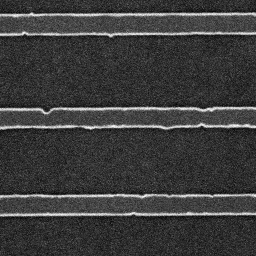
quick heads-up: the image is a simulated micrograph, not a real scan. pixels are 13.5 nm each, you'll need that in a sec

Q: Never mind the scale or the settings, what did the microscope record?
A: one or a few lines or trenches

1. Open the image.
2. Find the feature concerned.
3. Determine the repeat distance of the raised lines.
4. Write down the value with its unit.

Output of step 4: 1.22 micrometres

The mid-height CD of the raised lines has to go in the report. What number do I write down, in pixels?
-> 20.3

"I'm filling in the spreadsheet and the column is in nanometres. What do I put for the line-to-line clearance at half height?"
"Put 958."